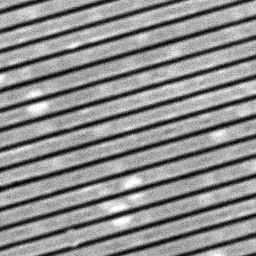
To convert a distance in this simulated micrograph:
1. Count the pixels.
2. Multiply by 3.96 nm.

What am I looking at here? parallel lines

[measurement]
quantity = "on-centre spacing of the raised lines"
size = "75.2 nanometres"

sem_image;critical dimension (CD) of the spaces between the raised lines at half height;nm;21.9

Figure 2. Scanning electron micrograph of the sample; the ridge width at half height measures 50.9 nm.